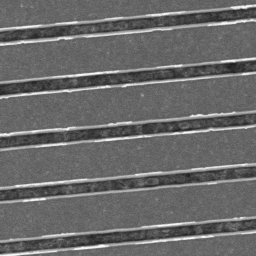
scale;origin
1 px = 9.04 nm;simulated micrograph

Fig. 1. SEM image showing parallel lines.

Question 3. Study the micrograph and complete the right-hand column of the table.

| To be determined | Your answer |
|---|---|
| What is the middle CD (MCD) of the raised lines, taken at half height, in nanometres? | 356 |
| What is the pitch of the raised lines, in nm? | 476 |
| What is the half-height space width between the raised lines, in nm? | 122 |